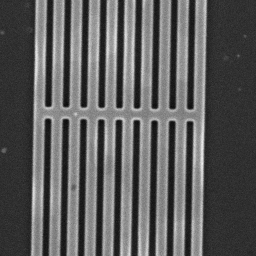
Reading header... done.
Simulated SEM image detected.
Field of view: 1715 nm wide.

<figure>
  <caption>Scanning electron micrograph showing groups of lines, slits or small figures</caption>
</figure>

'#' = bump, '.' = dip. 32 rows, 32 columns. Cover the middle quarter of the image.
..##..##...##..##...##..##..###.
..##..##...##..##..###..##..###.
..##..##...##..##..###..##..###.
..##..##...##..##..###..##..###.
..##..##..###..##..###..##..###.
..##..##..###..##..###..##..###.
..##..##..###..##..###..##..###.
..##..##..###..##..###..##..###.
..##..##..###..##..###..##..###.
.###..##..###..##..###..##..###.
.###..##..###..##..###..##..###.
###############################.
################################
.###############################
.###..##..###..##..###..##..###.
.###..##..###..##..###..##..##..
.###..##..###..##..###..##..##..
.###..##..###..##..###..##..##..
.###..##..###..##..###..##..##..
.###..##..###..##..###..##..##..
.###..##..###..##..###..##..##..
.###..##..###..##..###..##..##..
.###..##..###..##..###.###..##..
.###..##..###..##..##..###..##..
.###..##..###..##..##..###..##..
.###..##..###..##..##..###..##..
.###..##..###..##..##..###..##..
.###..##..###..##..##..###..##..
.###..##..###..##..##..###..##..
.###..##..###..##..##..###..##..
.###..##..###.###..##..###..##..
.###..##..##..###..##..###..##..